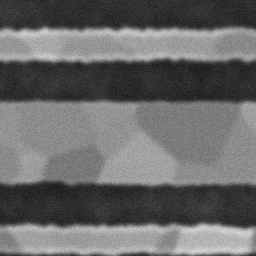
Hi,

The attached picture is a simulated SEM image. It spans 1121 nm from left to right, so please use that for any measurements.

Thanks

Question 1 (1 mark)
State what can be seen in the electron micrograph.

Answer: lines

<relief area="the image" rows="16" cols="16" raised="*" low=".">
................
................
****************
****************
................
................
****************
****************
****************
****************
****************
.........*.**...
................
................
****************
****************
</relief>